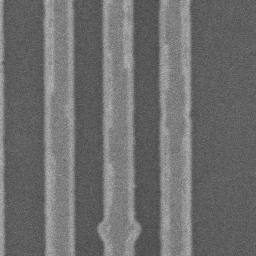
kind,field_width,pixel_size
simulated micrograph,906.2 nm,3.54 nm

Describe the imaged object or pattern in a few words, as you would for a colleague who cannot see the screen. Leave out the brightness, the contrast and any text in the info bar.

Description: one or a few lines or trenches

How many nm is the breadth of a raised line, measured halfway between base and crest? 89.3